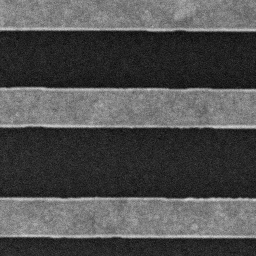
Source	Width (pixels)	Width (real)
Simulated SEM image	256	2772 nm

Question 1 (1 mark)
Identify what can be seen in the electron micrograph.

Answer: lines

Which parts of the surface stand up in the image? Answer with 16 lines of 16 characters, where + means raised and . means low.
++++++++++++++++
++++++++++++++++
................
................
................
+++.............
++++++++++++++++
++++++++++++++++
................
................
................
................
++++++++++++++++
++++++++++++++++
++++++++++++++++
................